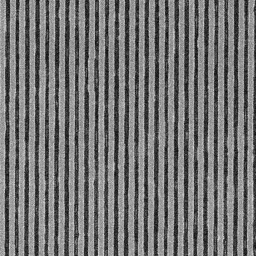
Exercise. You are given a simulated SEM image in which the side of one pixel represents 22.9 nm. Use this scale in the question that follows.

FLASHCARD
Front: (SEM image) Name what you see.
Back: parallel lines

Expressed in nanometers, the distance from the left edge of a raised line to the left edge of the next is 227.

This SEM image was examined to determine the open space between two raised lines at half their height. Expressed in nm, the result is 106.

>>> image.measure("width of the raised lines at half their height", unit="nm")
126